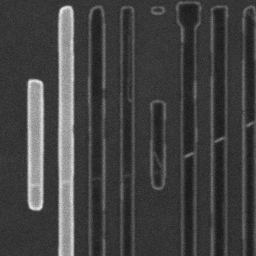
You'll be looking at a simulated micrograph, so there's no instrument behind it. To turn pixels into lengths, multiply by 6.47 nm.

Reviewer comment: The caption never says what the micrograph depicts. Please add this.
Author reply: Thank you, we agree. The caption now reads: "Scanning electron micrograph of wiring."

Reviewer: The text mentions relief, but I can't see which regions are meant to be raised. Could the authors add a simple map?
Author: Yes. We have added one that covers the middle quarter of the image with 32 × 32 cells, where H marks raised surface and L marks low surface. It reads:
HHLLLLLHHHLLLLHHHLLLLLLLLLLLLLHH
HHLLLLLHHHLLLLHHHLLLLLLLLLLLLLHH
HHLLLLLHHHLLLLHHHLLLLLLLLLLLLLHH
HHLLLLLHHHLLLLHHHLLLLLLLLLLLLLHH
HHLLLLLHHHLLLLHHHLLLLLLLLLLLLLHH
HHLLLLLHHHLLLLHHHLLLLLLLLLLLLLHH
HHLLLLLHHHLLLLHHHLLLLLLLLLLLLLHH
HHLLLLLHHHLLLLHHHLLLLLLLLLLLLLHH
HHLLLLLHHHLLLLHHHLLLLLLLLLLLLLHH
HHLLLLLHHHLLLLHHHLLLLLLLLLLLLLHH
HHLLLLLHHHLLLLHHHLLLLLHHHLLLLLHH
HHLLLLLHHHLLLLHHHLLLLLHHHLLLLLHH
HHLLLLLHHHLLLLHHHLLLLLHHHLLLLLHH
HHLLLLLHHHLLLLHHHLLLLLHHHLLLLLHH
HHLLLLLHHHLLLLHHHLLLLLHHHLLLLLHH
HHLLLLLHHHLLLLHHHLLLLLHHHLLLLLHH
HHLLLLLHHHLLLLHHHLLLLLHHHLLLLLHH
HHLLLLLHHHLLLLHHHLLLLLHHHLLLLLHH
HHLLLLLHHHLLLLHHHLLLLLHHHLLLLLHH
HHLLLLLHHHLLLLHHHLLLLLHHHLLLLLHH
HHLLLLLHHHLLLLHHHLLLLLHHHLLLLLHH
HHLLLLLHHHLLLLHHHLLLLLHHHLLLLLHH
HHLLLLLHHHLLLLHHHLLLLLHHHLLLLLHH
HHLLLLLHHHLLLLHHHLLLLLHHHLLLLLHH
HHLLLLLHHHLLLLHHHLLLLLHHHLLLLLHH
HHLLLLLHHHLLLLHHHLLLLLHHHLLLLLHH
HHLLLLLHHHLLLLHHHLLLLLHHHLLLLLHH
HHLLLLLHHHLLLLHHHLLLLLHHHLLLLLHH
HHLLLLLHHHLLLLHHHLLLLLHHHLLLLLHH
HHLLLLLHHHLLLLHHHLLLLLHHHLLLLLHH
HHLLLLLHHHLLLLLHHLLLLLHHHLLLLLHH
HHLLLLLHHHLLLLLHHLLLLLLLLLLLLLHH